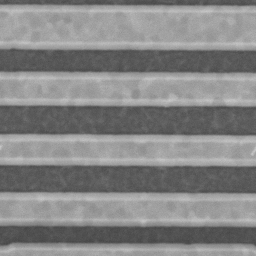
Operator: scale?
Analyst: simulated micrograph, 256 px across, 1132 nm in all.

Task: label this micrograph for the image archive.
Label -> one or a few lines or trenches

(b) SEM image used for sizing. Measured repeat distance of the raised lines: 268 nm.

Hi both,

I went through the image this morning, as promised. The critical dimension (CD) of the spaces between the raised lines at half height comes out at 140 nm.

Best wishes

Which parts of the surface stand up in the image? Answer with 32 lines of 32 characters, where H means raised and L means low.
LLLLLLLLLLLLLLLLLLLLLLLLLLLLLLLL
HHHHHHHHHHHHHHHHHHHHHHHHHHHHHHHH
HHHHHHHHHHHHHHHHHHHHHHHHHHHHHHHH
HHHHHHHHHHHHHHHHHHHHHHHHHHHHHHHH
HHHHHHHHHHHHHHHHHHHHHHHHHHHHHHHH
HHHHHHHHHHHHHHHHHHHHHHHHHHHHHHHH
LLLLLLLLLLLLLLLLLLLLLLLLLLLLLLLL
LLLLLLLLLLLLLLLLLLLLLLLLLLLLLLLL
LLLLLLLLLLLLLLLLLLLLLLLLLLLLLLLL
HHHHHHHHHHHHHHHLLLLLLLLLLLLLLLLL
HHHHHHHHHHHHHHHHHHHHHHHHHHHHHHHH
HHHHHHHHHHHHHHHHHHHHHHHHHHHHHHHH
HHHHHHHHHHHHHHHHHHHHHHHHHHHHHHHH
LLLLLLLLLLLLLLLLLLLLLLLLLLLLLLLL
LLLLLLLLLLLLLLLLLLLLLLLLLLLLLLLL
LLLLLLLLLLLLLLLLLLLLLLLLLLLLLLLL
LLLLLLLLLLLLLLLLLLLLLLLLLLLLLLLL
HHHHHHHHHHHHHHHHHHHHHHHHHHHHHHHH
HHHHHHHHHHHHHHHHHHHHHHHHHHHHHHHH
HHHHHHHHHHHHHHHHHHHHHHHHHHHHHHHH
LLLLLLLLLLLLLLLLLLLLLLLLLLLLLLLL
LLLLLLLLLLLLLLLLLLLLLLLLLLLLLLLL
LLLLLLLLLLLLLLLLLLLLLLLLLLLLLLLL
LLLLLLLLLLLLLLLLLLLLLLLLLLLLLLLL
HLLLLLLLLLLLLLLLLHHLLLLLLLLLLLLL
HHHHHHHHHHHHHHHHHHHHHHHHHHHHHHHH
HHHHHHHHHHHHHHHHHHHHHHHHHHHHHHHH
HHHHHHHHHHHHHHHHHHHHHHHHHHHHHHHH
LLLLLLLLLLLLLLLLLLLLLLLLLLLLLLLL
LLLLLLLLLLLLLLLLLLLLLLLLLLLLLLLL
LLLLLLLLLLLLLLLLLLLLLLLLLLLLLLLL
HHHHHHHHHHHHHHHHHHHHHHHHHHHHHHHH